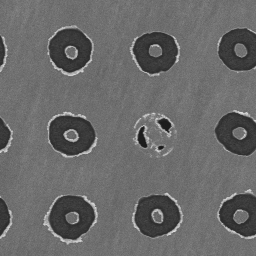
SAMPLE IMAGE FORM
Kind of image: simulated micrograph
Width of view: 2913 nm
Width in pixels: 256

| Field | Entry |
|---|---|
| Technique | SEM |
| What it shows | ring-shaped grooves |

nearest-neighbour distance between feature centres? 969 nm